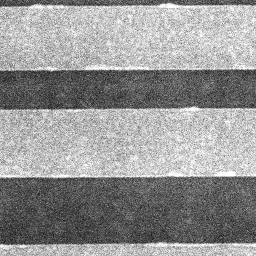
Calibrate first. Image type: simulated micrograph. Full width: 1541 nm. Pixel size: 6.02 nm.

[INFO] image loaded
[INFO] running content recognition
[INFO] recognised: one or a few lines or trenches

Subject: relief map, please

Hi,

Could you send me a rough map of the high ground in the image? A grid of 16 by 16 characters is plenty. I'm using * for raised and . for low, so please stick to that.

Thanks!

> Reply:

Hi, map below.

****************
****************
****************
****************
................
................
................
****************
****************
****************
****************
................
................
................
................
****************